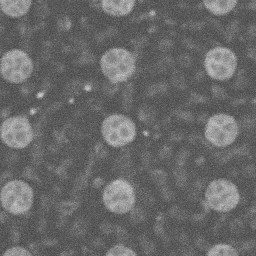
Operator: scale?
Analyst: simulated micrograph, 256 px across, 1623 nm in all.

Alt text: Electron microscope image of a regular array of raised bodies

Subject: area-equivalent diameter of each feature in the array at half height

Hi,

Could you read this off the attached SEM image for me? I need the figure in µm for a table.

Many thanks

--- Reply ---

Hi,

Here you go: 0.193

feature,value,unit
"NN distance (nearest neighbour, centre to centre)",417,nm